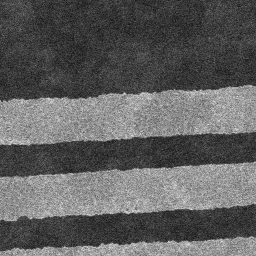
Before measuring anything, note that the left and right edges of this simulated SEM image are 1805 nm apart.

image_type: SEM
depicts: one or a few lines or trenches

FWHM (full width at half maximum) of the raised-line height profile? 0.299 microns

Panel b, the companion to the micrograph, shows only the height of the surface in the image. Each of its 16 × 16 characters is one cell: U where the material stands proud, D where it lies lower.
DDDDDDDDDDDDDDDD
DDDDDDDDDDDDDDDD
DDDDDDDDDDDDDDDD
DDDDDDDDDDDDDDDD
DDDDDDDDDDDDDDDD
DDDDDDDDDDDDDDDU
UUUUUUUUUUUUUUUU
UUUUUUUUUUUUUUUU
UUUUUUUUUUDDDDDD
DDDDDDDDDDDDDDDD
DDDDDDDDDDDUUUUU
UUUUUUUUUUUUUUUU
UUUUUUUUUUUUUUUU
UUUDDDDDDDDDDDDD
DDDDDDDDDDDDDDDD
DDDUUUUUUUUUUUUU